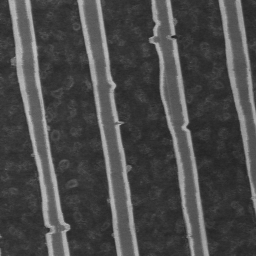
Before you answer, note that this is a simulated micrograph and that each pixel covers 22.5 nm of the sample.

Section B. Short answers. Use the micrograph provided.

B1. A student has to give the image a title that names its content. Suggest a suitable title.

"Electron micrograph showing one or a few lines or trenches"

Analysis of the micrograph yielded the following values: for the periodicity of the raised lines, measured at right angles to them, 1570 nanometres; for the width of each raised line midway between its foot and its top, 362 nm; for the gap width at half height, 1220 nm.